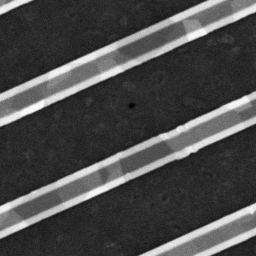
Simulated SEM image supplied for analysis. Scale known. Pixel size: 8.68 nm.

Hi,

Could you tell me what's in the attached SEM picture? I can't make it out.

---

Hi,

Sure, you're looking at one or a few lines or trenches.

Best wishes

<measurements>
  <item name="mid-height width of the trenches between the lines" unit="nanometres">683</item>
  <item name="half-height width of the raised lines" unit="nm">206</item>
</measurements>